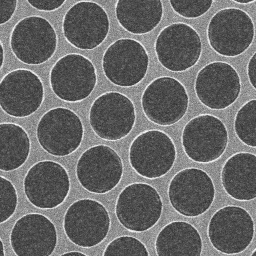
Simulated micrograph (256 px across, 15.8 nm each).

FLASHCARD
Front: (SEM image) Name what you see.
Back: a regular array of holes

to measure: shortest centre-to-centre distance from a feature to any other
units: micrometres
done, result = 0.864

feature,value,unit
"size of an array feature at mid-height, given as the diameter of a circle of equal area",746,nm